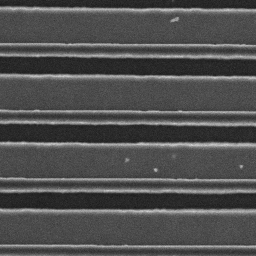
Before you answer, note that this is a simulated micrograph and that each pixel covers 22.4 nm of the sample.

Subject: lines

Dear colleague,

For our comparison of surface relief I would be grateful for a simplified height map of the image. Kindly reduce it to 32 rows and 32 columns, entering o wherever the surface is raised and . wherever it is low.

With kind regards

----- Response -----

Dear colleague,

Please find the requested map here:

................................
oooooooooooooooooooooooooooooooo
oooooooooooooooooooooooooooooooo
oooooooooooooooooooooooooooooooo
oooooooooooooooooooooooooooooooo
oooooooooooooooooooooooooooooooo
oooooooooooooooooooooooooooooooo
................................
................................
ooooooooo...o...................
oooooooooooooooooooooooooooooooo
oooooooooooooooooooooooooooooooo
oooooooooooooooooooooooooooooooo
oooooooooooooooooooooooooooooooo
oooooooooooooooooooooooooooooooo
...............................o
................................
................................
oooooooooooooooooooooooooooooooo
oooooooooooooooooooooooooooooooo
oooooooooooooooooooooooooooooooo
oooooooooooooooooooooooooooooooo
oooooooooooooooooooooooooooooooo
oooooooooooooooooooooooooooooooo
................................
................................
oooooooooooooooooooooooooooooooo
oooooooooooooooooooooooooooooooo
oooooooooooooooooooooooooooooooo
oooooooooooooooooooooooooooooooo
oooooooooooooooooooooooooooooooo
oooooooooooooooooooooooooooooooo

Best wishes